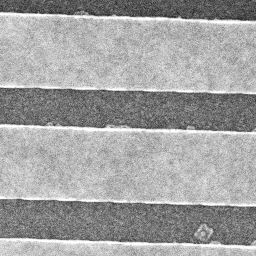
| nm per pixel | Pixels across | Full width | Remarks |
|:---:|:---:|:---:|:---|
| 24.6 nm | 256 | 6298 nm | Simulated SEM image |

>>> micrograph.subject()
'lines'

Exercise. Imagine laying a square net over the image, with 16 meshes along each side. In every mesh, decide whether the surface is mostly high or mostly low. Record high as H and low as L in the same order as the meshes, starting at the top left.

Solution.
LLLLLLLLLLLLLLLL
HHHHHHHHHHHHHHHH
HHHHHHHHHHHHHHHH
HHHHHHHHHHHHHHHH
HHHHHHHHHHHHHHHH
LLLLHHHHHHHHHHHH
LLLLLLLLLLLLLLLL
LLLLLLLLLLLLLLLL
HHHHHHHHHHHHHHHH
HHHHHHHHHHHHHHHH
HHHHHHHHHHHHHHHH
HHHHHHHHHHHHHHHH
LLLLLHHHHHHHHHHH
LLLLLLLLLLLLLLLL
LLLLLLLLLLLLLLLL
HHHHHHHHHHHHHHHH